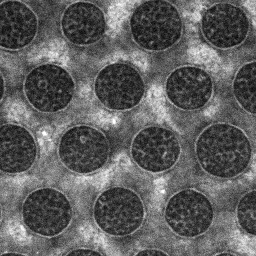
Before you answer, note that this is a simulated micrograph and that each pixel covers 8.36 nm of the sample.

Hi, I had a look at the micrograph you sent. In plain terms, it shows a regular array of raised bodies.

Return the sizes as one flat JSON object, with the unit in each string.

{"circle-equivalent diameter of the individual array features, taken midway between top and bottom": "416 nanometres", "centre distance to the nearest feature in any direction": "588 nanometers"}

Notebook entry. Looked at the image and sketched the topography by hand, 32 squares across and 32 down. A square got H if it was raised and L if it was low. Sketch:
HHHLLLLLLHHHLLLLLLHHHLLLLLLHHLLL
HHHHLLLLHHHHHLLLLHHHHHLLLLHHHHHL
HHHHHLLLHHHHHLLLHHHHHHHLLHHHHHHL
HHHHHLLLHHHHHLLLHHHHHHHLLHHHHHHL
HHHHLLLLHHHHHLLLLHHHHHHLLLHHHHHL
HHHHLLLLLHHHLLLLLHHHHHLLLLHHHHLL
LLLLLLLLLLLLLLLLLLLLLLLLLLLLLLLL
LLLLLLLLLLLLLLLLLLLLLLLLLLLLLLLL
LLLLHHHHLLLLLHHHHLLLLLHHHLLLLLHH
LLLHHHHHHLLLHHHHHHLLLHHHHHLLLHHH
HLLHHHHHHLLLHHHHHHLLLHHHHHHLLHHH
HLLHHHHHHLLLHHHHHHLLLHHHHHHLLHHH
LLLHHHHHHLLLHHHHHHLLLHHHHHLLLLHH
LLLLHHHHLLLLLHHHHLLLLLHHHLLLLLHH
LLLLLLLLLLLLLLLLLLLLLLLLLLLLLLLL
LHLLLLLLLLLLLLLLLLLLLLLLLLLHHLLL
HHHHLLLLHHHHHLLLLHHHHLLLLHHHHHLL
HHHHLLLLHHHHHLLLLHHHHHLLLHHHHHHL
HHHHHLLHHHHHHHLLHHHHHHHLHHHHHHHL
HHHHHLLHHHHHHHLLHHHHHHLLLHHHHHHL
HHHHLLLLHHHHHLLLLHHHHHLLLHHHHHHL
HHHLLLLLLHHHLLLLLLLHLLLLLLHHHHLL
LLLLLLLLLLLLLLLLLLLLLLLLLLLLLLLL
LLLLLLLLLLLLLLHHLLLLLLLLLLLLLLLL
LLLHHHHHLLLLHHHHHLLLLLHHHHLLLLHH
LLLHHHHHHLLLHHHHHHLLLHHHHHLLLLHH
LLLHHHHHHLLLHHHHHHLLLHHHHHHLLLHH
LLLHHHHHHLLLHHHHHHLLLHHHHHHLLLHH
LLLHHHHHLLLLHHHHHLLLLHHHHHLLLLHH
LLLLLLHLLLLLLLLLLLLLLLHHHLLLLLLL
LLLLLLLLLLLLLLLLLLLLLLLLLLLLLLLL
LLLLLLLLLHHHLLLLLHHHHLLLLLLLLLLL